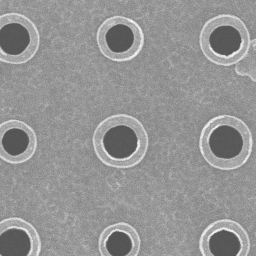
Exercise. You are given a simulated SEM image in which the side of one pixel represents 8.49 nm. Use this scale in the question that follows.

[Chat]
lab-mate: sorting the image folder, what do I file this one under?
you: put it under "ring-shaped raised bodies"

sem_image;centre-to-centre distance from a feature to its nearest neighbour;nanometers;872